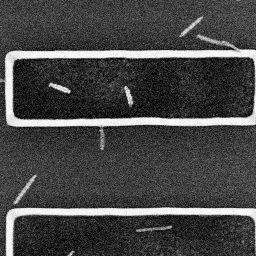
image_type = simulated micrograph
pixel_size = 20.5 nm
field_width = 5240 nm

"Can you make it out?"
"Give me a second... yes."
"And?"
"wiring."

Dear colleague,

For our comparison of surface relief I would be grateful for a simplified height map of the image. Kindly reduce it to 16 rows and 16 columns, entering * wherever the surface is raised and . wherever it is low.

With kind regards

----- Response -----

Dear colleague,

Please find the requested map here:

................
................
................
.***************
.***************
.***************
.***************
.***************
................
................
................
................
................
.***************
.***************
.***************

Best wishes